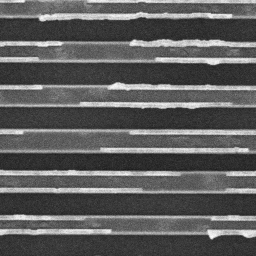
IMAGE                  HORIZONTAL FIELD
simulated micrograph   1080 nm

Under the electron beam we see parallel lines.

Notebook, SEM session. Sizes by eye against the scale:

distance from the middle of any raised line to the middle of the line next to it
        183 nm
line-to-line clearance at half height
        0.0982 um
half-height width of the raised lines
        90.8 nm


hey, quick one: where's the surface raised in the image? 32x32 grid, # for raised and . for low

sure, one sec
################################
################################
.....###........................
................................
................................
################################
################################
################################
................................
................................
..............##.#..............
################################
################################
.................#####.##.......
................................
................................
################################
################################
################################
................................
................................
#################.####...#..####
################################
################################
................................
................................
................................
################################
################################
..........................#...##
................................
................................